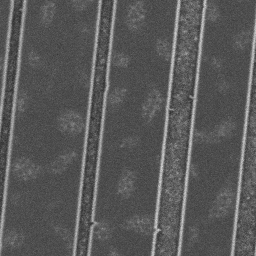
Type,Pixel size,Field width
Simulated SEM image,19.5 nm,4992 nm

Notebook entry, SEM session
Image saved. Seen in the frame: one or a few lines or trenches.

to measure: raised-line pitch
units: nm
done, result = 1640